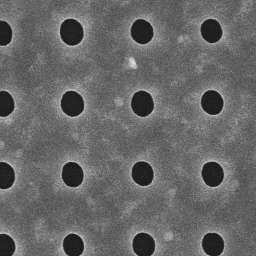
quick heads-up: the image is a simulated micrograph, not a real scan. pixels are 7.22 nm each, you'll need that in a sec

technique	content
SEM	a regular array of holes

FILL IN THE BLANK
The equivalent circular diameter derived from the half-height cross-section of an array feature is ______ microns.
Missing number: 0.174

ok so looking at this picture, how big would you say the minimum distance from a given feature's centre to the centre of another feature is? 0.503 um